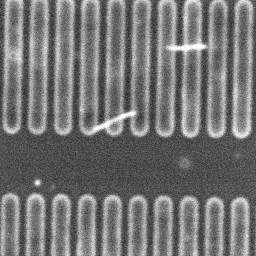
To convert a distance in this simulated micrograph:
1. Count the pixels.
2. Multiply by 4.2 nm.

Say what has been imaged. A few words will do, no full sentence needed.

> groups of lines, slits or small figures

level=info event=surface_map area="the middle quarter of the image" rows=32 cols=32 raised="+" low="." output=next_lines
++..++++...++++..++++...+++...++
++..++++...++++..++++...+++...++
++..++++...++++..++++...+++...++
++..++++...++++..++++...++++..++
++..++++...++++..++++...+++...++
++..++++...++++..++++...+++...++
++..++++...++++..++++...+++...++
++..++++...++++..++++...+++...++
++..++++...++++..++++...+++...++
++..++++...++++..++++..++++...++
++..++++...++++..++++..++++...++
++..++++...++++..++++..++++...++
++..++++...++++..++++..++++...++
++..++++...++++..++++..++++...++
++..++++...++++..++++..++++...++
++..++++..+++++..++++..++++...++
+...++++...+++...++++..++++...++
............+.....++....++....++
................................
................................
................................
................................
................................
................................
................................
................................
................................
................................
................................
................................
................................
................................